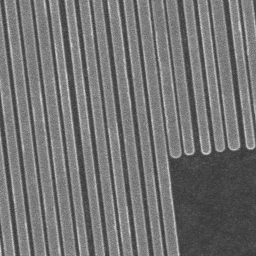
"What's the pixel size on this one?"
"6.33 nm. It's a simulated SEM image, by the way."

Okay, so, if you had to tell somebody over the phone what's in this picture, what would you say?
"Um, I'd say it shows parallel lines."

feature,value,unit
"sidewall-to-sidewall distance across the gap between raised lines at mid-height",29.8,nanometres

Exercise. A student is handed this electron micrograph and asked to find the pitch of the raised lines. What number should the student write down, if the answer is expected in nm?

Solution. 93.5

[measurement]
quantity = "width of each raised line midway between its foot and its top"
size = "9.43 px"